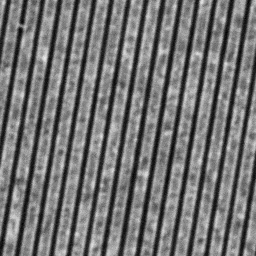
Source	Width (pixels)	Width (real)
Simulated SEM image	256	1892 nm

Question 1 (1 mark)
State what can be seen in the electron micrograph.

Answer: parallel lines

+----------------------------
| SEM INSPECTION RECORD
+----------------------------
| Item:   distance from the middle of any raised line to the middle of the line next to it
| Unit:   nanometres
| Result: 125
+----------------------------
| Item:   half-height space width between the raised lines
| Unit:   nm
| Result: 51.9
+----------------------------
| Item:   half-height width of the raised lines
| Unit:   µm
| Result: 0.0711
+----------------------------